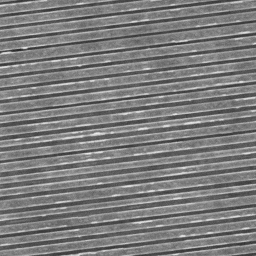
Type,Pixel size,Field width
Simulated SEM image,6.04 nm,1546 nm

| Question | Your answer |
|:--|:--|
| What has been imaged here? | parallel lines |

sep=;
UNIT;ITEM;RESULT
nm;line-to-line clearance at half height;21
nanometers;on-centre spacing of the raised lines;73.4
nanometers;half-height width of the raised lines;52.4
